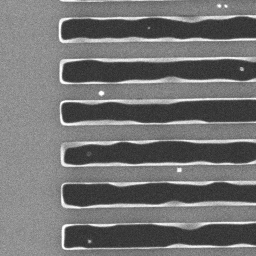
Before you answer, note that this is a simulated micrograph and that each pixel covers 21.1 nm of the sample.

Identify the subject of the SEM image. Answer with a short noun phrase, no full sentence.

groups of lines, slits or small figures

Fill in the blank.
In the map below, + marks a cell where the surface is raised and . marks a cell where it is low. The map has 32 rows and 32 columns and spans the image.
................................
................................
........++++++++++++++++++++++++
........++++++++++++++++++++++++
........++++++++++++++++++++++++
................................
................................
.........++++........+++++++++++
........++++++++++++++++++++++++
........++++++++++++++++++++++++
................................
................................
.......................+++++++++
........++++++++++++++++++++++++
........++++++++++++++++++++++++
................................
................................
................................
........++++++++++++++++++++++++
........++++++++++++++++++++++++
........++++....++..............
................................
................................
........++++++++++++++++++++++++
........++++++++++++++++++++++++
........++++++++++++++++++.....+
................................
................................
........++++++++++++++++++++++++
........++++++++++++++++++++++++
........++++++++++++++++++++++++
................................